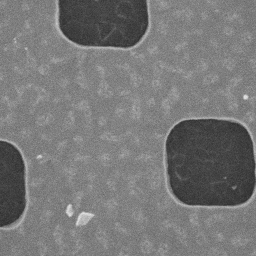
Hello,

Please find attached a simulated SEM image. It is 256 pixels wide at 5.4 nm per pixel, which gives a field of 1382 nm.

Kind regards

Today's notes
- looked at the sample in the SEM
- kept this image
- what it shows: holes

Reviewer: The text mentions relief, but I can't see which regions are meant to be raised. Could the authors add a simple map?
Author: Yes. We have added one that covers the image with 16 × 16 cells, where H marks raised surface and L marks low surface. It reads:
HHHHLLLLLHHHHHHH
HHHHLLLLLHHHHHHH
HHHHLLLLLHHHHHHH
HHHHHHHHHHHHHHHH
HHHHHHHHHHHHHHHH
HHHHHHHHHHHHHHHH
HHHHHHHHHHHHHHHH
HHHHHHHHHHHHLLHH
HHHHHHHHHHHLLLLL
LHHHHHHHHHLLLLLL
LLHHHHHHHHLLLLLL
LLHHHHHHHHLLLLLL
LLHHHHHHHHHLLLLH
LHHHHHHHHHHHHHHH
HHHHHHHHHHHHHHHH
HHHHHHHHHHHHHHHH